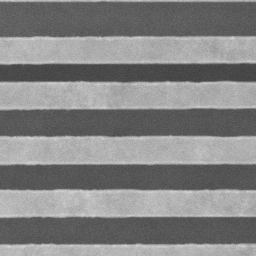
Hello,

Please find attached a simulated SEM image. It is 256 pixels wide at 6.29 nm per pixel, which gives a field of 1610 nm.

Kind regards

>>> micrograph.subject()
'lines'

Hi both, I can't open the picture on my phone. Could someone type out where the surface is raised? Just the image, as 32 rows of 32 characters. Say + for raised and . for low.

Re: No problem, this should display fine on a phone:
................................
................................
................................
................................
................................
++++++++++++++++++++++++++++++++
++++++++++++++++++++++++++++++++
++++++++++++++++++++++++++++++++
................................
................................
++++++++++++++++++++++++++++++++
++++++++++++++++++++++++++++++++
++++++++++++++++++++++++++++++++
++++++++++++++++++++++++...+.+..
................................
................................
................................
++++++++++++++++++++++++++++++++
++++++++++++++++++++++++++++++++
++++++++++++++++++++++++++++++++
++.++...........................
................................
................................
................................
++++++++++++++++++++++++++++++++
++++++++++++++++++++++++++++++++
++++++++++++++++++++++++++++++++
................................
................................
................................
................................
++++++++++++++++++++++++++++++++